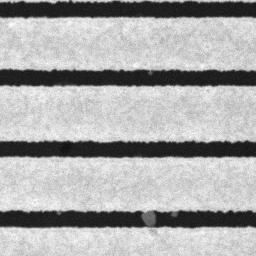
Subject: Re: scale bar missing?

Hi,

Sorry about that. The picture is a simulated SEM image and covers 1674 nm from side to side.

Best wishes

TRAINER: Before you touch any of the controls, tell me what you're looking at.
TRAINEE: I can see lines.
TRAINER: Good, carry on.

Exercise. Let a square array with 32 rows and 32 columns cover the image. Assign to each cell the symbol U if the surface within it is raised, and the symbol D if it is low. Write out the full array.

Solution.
DDDDDDDDDDDDDDDDDDDDDDDDDDDDDDDD
DDDDDDDDDDDDDDDDDDDDDDDDDDDDDDDD
UUUUUUUUUUUUUUUUUUUUUUUUUUUUUUUU
UUUUUUUUUUUUUUUUUUUUUUUUUUUUUUUU
UUUUUUUUUUUUUUUUUUUUUUUUUUUUUUUU
UUUUUUUUUUUUUUUUUUUUUUUUUUUUUUUU
UUUUUUUUUUUUUUUUUUUUUUUUUUUUUUUU
UUUUUUUUUUUUUUUUUUUUUUUUUUUUUUUU
UUUUUUUUUUUUUUUUUUUUUUUUUUUUUUUU
DDDDDDDDDDDDDDDDDDDDDDDDDDDDDDDD
DDDDDDDDDDDDDDDDDDDDDDDDDDDDDDDD
UUUUUUUUUUUUUUUUUUUUUUUUUUUUUUUU
UUUUUUUUUUUUUUUUUUUUUUUUUUUUUUUU
UUUUUUUUUUUUUUUUUUUUUUUUUUUUUUUU
UUUUUUUUUUUUUUUUUUUUUUUUUUUUUUUU
UUUUUUUUUUUUUUUUUUUUUUUUUUUUUUUU
UUUUUUUUUUUUUUUUUUUUUUUUUUUUUUUU
UUUUUUUUUUUUUUUUUUUUUUUUUUUUUUUU
DDDDDDDDDDDDDDDDDDDDDDDDDDDDDDDD
DDDDDDDDDDDDDDDDDDDDDDDDDDDDDDDD
UUUUUUUUUUUUUUUUUUUUUUUUUUUUUUUU
UUUUUUUUUUUUUUUUUUUUUUUUUUUUUUUU
UUUUUUUUUUUUUUUUUUUUUUUUUUUUUUUU
UUUUUUUUUUUUUUUUUUUUUUUUUUUUUUUU
UUUUUUUUUUUUUUUUUUUUUUUUUUUUUUUU
UUUUUUUUUUUUUUUUUUUUUUUUUUUUUUUU
DDDDDDDDDDDDDDDDDDDDDDDDDDDDDDDD
DDDDDDDDDDDDDDDDDDDDDDDDDDDDDDDD
UUUDDDUUUUDDDUUUUDUDUDUDDUUUUDDU
UUUUUUUUUUUUUUUUUUUUUUUUUUUUUUUU
UUUUUUUUUUUUUUUUUUUUUUUUUUUUUUUU
UUUUUUUUUUUUUUUUUUUUUUUUUUUUUUUU